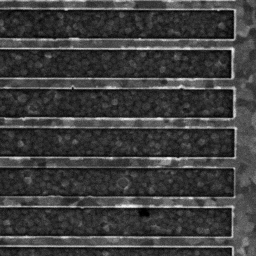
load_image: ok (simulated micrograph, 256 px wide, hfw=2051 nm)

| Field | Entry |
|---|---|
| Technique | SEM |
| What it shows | parallel lines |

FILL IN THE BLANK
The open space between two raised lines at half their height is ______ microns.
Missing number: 0.233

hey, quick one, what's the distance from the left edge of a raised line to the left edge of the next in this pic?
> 316 nm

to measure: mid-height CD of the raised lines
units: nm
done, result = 84.1